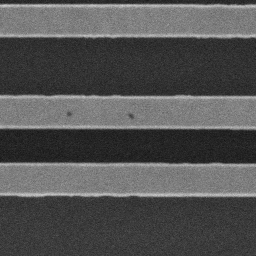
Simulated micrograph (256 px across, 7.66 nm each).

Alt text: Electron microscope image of lines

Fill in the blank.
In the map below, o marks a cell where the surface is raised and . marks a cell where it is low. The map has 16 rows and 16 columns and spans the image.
oooooooooooooooo
oooooooooooooooo
................
................
................
................
oooooooooooooooo
oooooooooooooooo
................
................
oooooooooooooooo
oooooooooooooooo
................
................
................
................